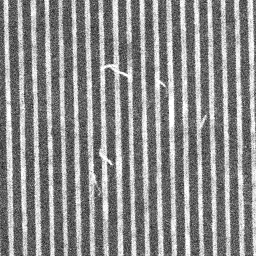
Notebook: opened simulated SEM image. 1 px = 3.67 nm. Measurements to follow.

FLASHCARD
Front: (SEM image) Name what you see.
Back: parallel lines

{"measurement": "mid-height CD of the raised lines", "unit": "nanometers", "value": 12.4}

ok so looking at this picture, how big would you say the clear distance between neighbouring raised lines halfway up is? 37.1 nm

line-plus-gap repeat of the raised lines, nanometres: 49.8